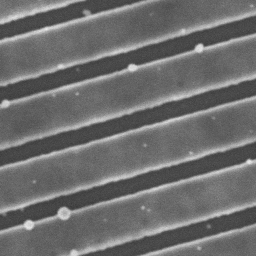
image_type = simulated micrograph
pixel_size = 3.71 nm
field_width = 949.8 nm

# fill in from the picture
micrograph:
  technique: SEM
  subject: lines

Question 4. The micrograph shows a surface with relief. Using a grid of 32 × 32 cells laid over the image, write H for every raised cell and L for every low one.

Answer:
HHHHHHHHHLLLLLLLLHHHHHHHHHHHHHHH
HHHHHLLLLLLLLHHHHHHHHHHHHHHHHHHH
HHLLLLLLLHHHHHHHHHHHHHHHHHHHHHLL
LLLLLLHHHHHHHHHHHHHHHHHHHHLLLLLL
LLHHHHHHHHHHHHHHHHHHHHLLLLLLLLLH
HHHHHHHHHHHHHHHHHHHLLLLLLLLHHHHH
HHHHHHHHHHHHHHHHLLLLLLLHHHHHHHHH
HHHHHHHHHHHHLLLLLLLLHHHHHHHHHHHH
HHHHHHHHLLLLLLLLHHHHHHHHHHHHHHHH
HHHHHLLLLLLLLHHHHHHHHHHHHHHHHHHH
HLLLLLLLLHHHHHHHHHHHHHHHHHHHHHLL
LLLLLLHHHHHHHHHHHHHHHHHHHHLLLLLL
LLHHHHHHHHHHHHHHHHHHHHLLLLLLLLHH
HHHHHHHHHHHHHHHHHHHLLLLLLLLHHHHH
HHHHHHHHHHHHHHHLLLLLLLLHHHHHHHHH
HHHHHHHHHHHLLLLLLLLHHHHHHHHHHHHH
HHHHHHHHLLLLLLLLHHHHHHHHHHHHHHHH
HHHHLLLLLLLLHHHHHHHHHHHHHHHHHHHH
HLLLLLLLHHHHHHHHHHHHHHHHHHHHHLLL
LLLLLHHHHHHHHHHHHHHHHHHHHLLLLLLL
LHHHHHHHHHHHHHHHHHHHHHLLLLLLLLHH
HHHHHHHHHHHHHHHHHHLLLLLLLLHHHHHH
HHHHHHHHHHHHHHHLLLLLLLLHHHHHHHHH
HHHHHHHHHHHLLLLLLLLHHHHHHHHHHHHH
HHHHHHHLLLLLLLLLHHHHHHHHHHHHHHHH
HHHHLLLLLLLLHHHHHHHHHHHHHHHHHHHH
HLLLLLLHHHHHHHHHHHHHHHHHHHHHHLLL
LLLLLHHHHHHHHHHHHHHHHHHHHHLLLLLL
LHHHHHHHHHHHHHHHHHHHHHLLLLLLLLHH
HHHHHHHHHHHHHHHHHHLLLLLLLLHHHHHH
HHHHHHHHHHHHHHHLLLLLLLLHHHHHHHHH
HHHHHHHHHHHLLLLLLLLHHHHHHHHHHHHH